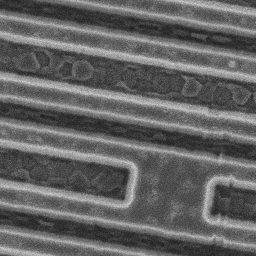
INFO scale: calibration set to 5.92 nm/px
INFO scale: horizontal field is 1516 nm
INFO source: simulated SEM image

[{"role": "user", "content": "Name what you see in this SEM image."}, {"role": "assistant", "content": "parallel lines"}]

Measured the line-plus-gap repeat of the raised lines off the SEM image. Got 54.4 pixels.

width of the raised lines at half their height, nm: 130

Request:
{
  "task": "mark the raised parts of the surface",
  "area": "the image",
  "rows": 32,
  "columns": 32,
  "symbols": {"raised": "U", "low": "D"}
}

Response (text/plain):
DDDDDDDDDDUUUUUUUUUUUUUUUUDDDDDD
DDDDDDDDDDDDDDDDUUUUUUUUUUUUUUUU
UUUUUDDDDDDDDDDDDDDDDUUUUUUUUUUU
UUUUUUUUUUDDDDDDDDDDDDDDDDDUUUUU
DUUUUUUUUUUUUUUUUDDDDDDDDDDDDDDD
DDDDDDUUUUUUUUUUUUUUUUDDDDDDDDDD
DDDDDDDDDDDDUUUUUUUUUUUUUUUUDDDD
DDDDDDDDDDDDDDDDDDUUUUUUUUUUUUUU
DDDDDDDDDDDDDDDDDDDDDDDUUUUUUUUU
DDDDDDDDDDDDDDDDDDDDDDDDDDDDDDUU
UUUUUUDDDDDDDDDDDDDDDDDDDDDDDDDD
UUUUUUUUUUUUDDDDDDDDDDDDDDDDDDDD
DDUUUUUUUUUUUUUUUUDDDDDDDDDDDDDD
DDDDDDDDUUUUUUUUUUUUUUUDDDDDDDDD
DDDDDDDDDDDDDDUUUUUUUUUUUUUUUUDD
UUUDDDDDDDDDDDDDDDDUUUUUUUUUUUUU
UUUUUUUUDDDDDDDDDDDDDDDDDUUUUUUU
UUUUUUUUUUUUUUDDDDDDDDDDDDDDDDUU
DDDDUUUUUUUUUUUUUUUUDDDDDDDDDDDD
DDDDDDDDDDUUUUUUUUUUUUUUUUDDDDDD
DDDDDDDDDDDDDDDUUUUUUUUUUUUUUUUU
DDDDDDDDDDDDDDDDDUUUUUUUUUUUUUUU
DDDDDDDDDDDDDDDDDUUUUUUUUUUUUUUU
UUUUDDDDDDDDDDDDUUUUUUUUUUDDDDDD
UUUUUUUUUDDDDDDDUUUUUUUUUUDDDDDD
UUUUUUUUUUUUUUUUUUUUUUUUUUDDDDDD
DDDDDUUUUUUUUUUUUUUUUUUUUUDDDDDD
DDDDDDDDDDUUUUUUUUUUUUUUUUUUDDDD
DDDDDDDDDDDDDDDDUUUUUUUUUUUUUUUU
UUUUUUDDDDDDDDDDDDDDDDUUUUUUUUUU
UUUUUUUUUUUUDDDDDDDDDDDDDDDDUUUU
DUUUUUUUUUUUUUUUUUDDDDDDDDDDDDDD